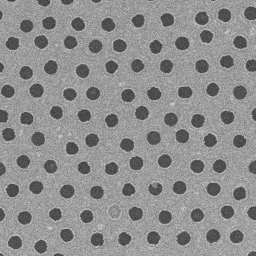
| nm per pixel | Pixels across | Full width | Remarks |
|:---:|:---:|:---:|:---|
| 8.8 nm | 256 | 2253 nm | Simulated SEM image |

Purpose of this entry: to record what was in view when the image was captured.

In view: a regular array of holes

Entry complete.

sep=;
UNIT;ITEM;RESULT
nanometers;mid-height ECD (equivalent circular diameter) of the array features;122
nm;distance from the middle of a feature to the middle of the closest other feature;210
